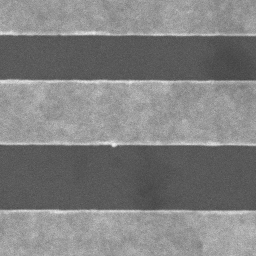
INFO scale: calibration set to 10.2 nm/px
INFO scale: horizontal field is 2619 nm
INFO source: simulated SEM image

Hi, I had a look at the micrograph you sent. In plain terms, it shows wiring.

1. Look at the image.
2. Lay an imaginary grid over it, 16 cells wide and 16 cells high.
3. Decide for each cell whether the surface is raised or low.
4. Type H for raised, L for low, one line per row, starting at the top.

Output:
HHHHHHHHHHHHHHHH
HHHHHHHHHHHHHHHH
LLLLLLLLLLLLLLLL
LLLLLLLLLLLLLLLL
LLLLLLLLLLLLLLLL
HHHHHHHHHHHHHHHH
HHHHHHHHHHHHHHHH
HHHHHHHHHHHHHHHH
HHHHHHHHHHHHHHHH
LLLLLLLLLLLLLLLL
LLLLLLLLLLLLLLLL
LLLLLLLLLLLLLLLL
LLLLLLLLLLLLLLLL
HHHHHHHHHHHHHHHH
HHHHHHHHHHHHHHHH
HHHHHHHHHHHHHHHH